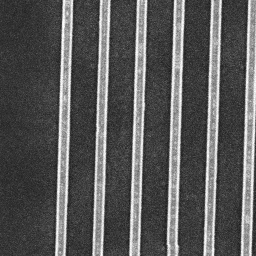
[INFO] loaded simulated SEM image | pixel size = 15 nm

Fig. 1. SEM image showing parallel lines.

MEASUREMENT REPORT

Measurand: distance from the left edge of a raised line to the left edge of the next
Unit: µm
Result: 0.556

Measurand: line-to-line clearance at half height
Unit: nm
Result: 430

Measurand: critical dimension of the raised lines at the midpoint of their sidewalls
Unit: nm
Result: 120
